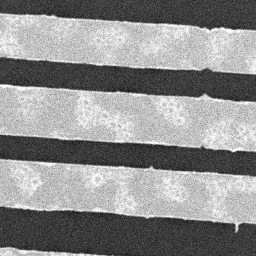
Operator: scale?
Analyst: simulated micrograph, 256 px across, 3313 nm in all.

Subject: one or a few lines or trenches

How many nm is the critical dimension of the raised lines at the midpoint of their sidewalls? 594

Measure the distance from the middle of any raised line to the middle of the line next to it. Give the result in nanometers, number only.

952